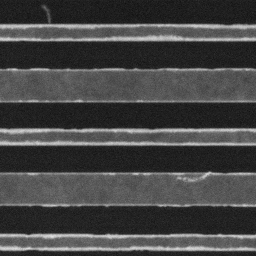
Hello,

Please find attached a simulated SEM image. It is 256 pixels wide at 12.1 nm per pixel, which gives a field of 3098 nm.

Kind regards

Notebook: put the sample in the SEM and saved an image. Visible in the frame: lines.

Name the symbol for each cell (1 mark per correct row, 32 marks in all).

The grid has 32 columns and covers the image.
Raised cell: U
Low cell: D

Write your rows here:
DDDDDDDDDDDDDDDDDDDDDDDDDDDDDDDD
DDDDDDDDDDDDDDDDDDDDDDDDDDDDDDDD
DDDDDDDDDDDDDDDDDDDDDDDDDDDDDDDD
UUUUUUUUUUUUUUUUUUUUUUUUUUUUUUUU
UUUUUUUUUUUUUUUUUUUUUUUUUUUUUUUU
DDDDDDDDDDDDDDDDDDDDDDDDDDDDDDDD
DDDDDDDDDDDDDDDDDDDDDDDDDDDDDDDD
DDDDDDDDDDDDDDDDDDDDDDDDDDDDDDDD
DDDDDDDDDDDDDDDDDDDDDDDDDDDDDDDD
UUUUUUUUUUUUUUUUUUUUUUUUUUUUUUUU
UUUUUUUUUUUUUUUUUUUUUUUUUUUUUUUU
UUUUUUUUUUUUUUUUUUUUUUUUUUUUUUUU
UUUUUUUUUUUUUUUUUUUUUUUUUUUUUUUU
DDDDDDDDDDDDDDDDDDDDDDDDDDDDDDDD
DDDDDDDDDDDDDDDDDDDDDDDDDDDDDDDD
DDDDDDDDDDDDDDDDDDDDDDDDDDDDDDDD
UUUUUUUUUUUUUUUUUUUUUUUUUUUUUUUU
UUUUUUUUUUUUUUUUUUUUUUUUUUUUUUUU
DDDDDDDDDDDDDDDDDDDDDDDDDDDDDDDD
DDDDDDDDDDDDDDDDDDDDDDDDDDDDDDDD
DDDDDDDDDDDDDDDDDDDDDDDDDDDDDDDD
DDDDDDDDDDDDDDDDDDDDDDDDDDDDDDDD
UUUUUUUUUUUUUUUUUUUUUUUUUUUUUUUU
UUUUUUUUUUUUUUUUUUUUUUUUUUUUUUUU
UUUUUUUUUUUUUUUUUUUUUUUUUUUUUUUU
UUUUUUUUUUUUUUUUUUUUUUUUUUUUUUUU
DDDDDDDDDDDDDDDDDDDDDDDDDDDDDDDD
DDDDDDDDDDDDDDDDDDDDDDDDDDDDDDDD
DDDDDDDDDDDDDDDDDDDDDDDDDDDDDDDD
UUUUUUUUUUUUUUUUUUUUUUUUUUUUUUUU
UUUUUUUUUUUUUUUUUUUUUUUUUUUUUUUU
DDDDDDDDDDDDDDDDDDDDDDDDDDDDDDDD